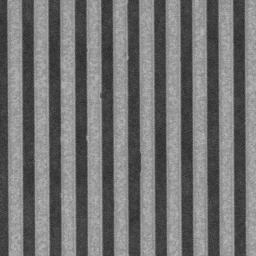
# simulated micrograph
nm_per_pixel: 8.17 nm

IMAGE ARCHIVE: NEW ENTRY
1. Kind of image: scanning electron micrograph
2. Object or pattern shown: parallel lines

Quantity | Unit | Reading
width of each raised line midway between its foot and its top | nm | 108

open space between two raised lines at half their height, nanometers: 107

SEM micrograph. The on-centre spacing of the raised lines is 216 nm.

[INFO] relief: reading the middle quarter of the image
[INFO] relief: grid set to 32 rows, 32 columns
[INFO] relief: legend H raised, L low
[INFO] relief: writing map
HHHLLLHHHLLLHHHHLLLHHHLLLLHHHLLL
HHHLLLHHHLLLHHHHLLLHHHLLLLHHHLLL
HHHLLLHHHLLLHHHHLLLHHHLLLLHHHLLL
HHHLLLHHHLLLHHHHLLLHHHLLLLHHHLLL
HHHLLLHHHLLLHHHHLLLHHHLLLLHHHLLL
HHHLLLHHHLLLHHHHLLLHHHLLLLHHHLLL
HHHLLLHHHLLLLHHHLLLHHHLLLLHHHLLL
HHHLLLHHHLLLLHHHLLLHHHLLLLHHHLLL
HHHLLLHHHLLLLHHHLLLHHHLLLLHHHLLL
HHHLLLHHHLLLLHHHLLLHHHLLLLHHHLLL
HHHLLLHHHLLLLHHHLLLHHHLLLLHHHLLL
HHHLLLHHHLLLLHHHLLLHHHLLLLHHHLLL
HHHLLLHHHLLLLHHHLLLHHHLLLLHHHLLL
HHHLLLHHHLLLLHHHLLLHHHLLLLHHHLLL
HHHLLLHHHLLLLHHHLLLHHHLLLLHHHLLL
HHHLLLHHHLLLLHHHLLLHHHLLLLHHHLLL
HHHLLLHHHLLLLHHHLLLHHHLLLLHHHLLL
HHHLLLHHHLLLLHHHLLLHHHLLLLHHHLLL
HHHLLLHHHLLLLHHHLLLHHHLLLLHHHLLL
HHHLLLHHHLLLLHHHLLLHHHLLLLHHHLLL
HHHLLLHHHLLLLHHHLLLHHHLLLLHHHLLL
HHHLLLHHHLLLLHHHLLLHHHLLLLHHHLLL
HHHLLLHHHLLLLHHHLLLHHHLLLLHHHLLL
HHHLLLHHHLLLLHHHLLLHHHLLLLHHHLLL
HHHLLLHHHLLLLHHHLLLHHHLLLLHHHLLL
HHHLLLHHHLLLLHHHLLLHHHLLLLHHHLLL
HHHLLLHHHLLLLHHHLLLHHHLLLLHHHLLL
HHHLLLHHHLLLLHHHLLLHHHLLLLHHHLLL
HHHLLLHHHLLLLHHHLLLHHHLLLLHHHLLL
HHHLLLHHHLLLLHHHLLLHHHLLLLHHHLLL
HHHLLLHHHLLLLHHHLLLHHHLLLLHHHLLL
HHHLLLHHHLLLLHHHLLLHHHLLLLHHHLLL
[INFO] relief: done